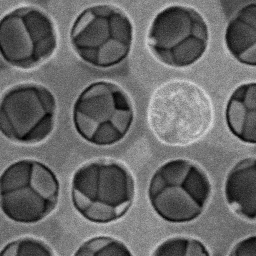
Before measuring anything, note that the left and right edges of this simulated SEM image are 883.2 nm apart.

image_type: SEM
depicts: holes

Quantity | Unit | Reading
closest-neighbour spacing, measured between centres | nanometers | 264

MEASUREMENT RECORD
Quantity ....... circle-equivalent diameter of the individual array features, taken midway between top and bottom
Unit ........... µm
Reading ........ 0.215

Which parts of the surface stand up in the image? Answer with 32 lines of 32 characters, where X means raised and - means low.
XXXXXXXXXXXXXXXXXXXXXXXXXXXXXXX-
X-----XXXX-----XXXXX-----XXXXX--
-------XX-------XXX------XXXX---
-------XX--------XX-------XX----
-------XX--------X--------XX----
-------XX-------XX--------XX----
-------XX-------XXX------XXXX---
X-----XXXX-----XXXXX-----XXXXX--
XXX-XXXXXXXXXXXXXXXXXXXXXXXXXXXX
XXXXXXXXXXXXXXXXXXXXXXXXXXXXXXXX
XX---XXXXXXX--XXXXXXX---XXXXXX--
X-----XXXX------XXXX-----XXXX---
-------XXX------XXX-------XXX---
-------XX--------XX-------XX----
-------XX--------XX-------XXXX--
-------XX-------XXX-------XXXX--
------XXXX------XXX-------XXX---
X----XXXXXX----XXXXX----XXXXXX--
XXXXXXXXXXXXXXXXXXXXXXXXXXXXXXXX
XXXXXXXXXXXXXXXXXXXXXXXXXXXXXXXX
XX---XXXXXX----XXXXXX----XXXXX--
-------XX-------XXX-------XXX---
-------XX--------XX-------XX----
-------XX--------XX-------XX----
-------XX--------XX-------XX----
-------XX-------XXX-------XXX---
------XXXX------XXXX-----XXXX---
X----XXXXXX----XXXXXX---XXXXXXX-
XXXXXXXXXXXXXXXXXXXXXXXXXXXXXXXX
XXXXXXXXXXXXXXXXXXXXXX-XXXXXXXXX
X-----XXXX-----XXXXX-----XXXX---
-------XX-------XXX-------XXX---